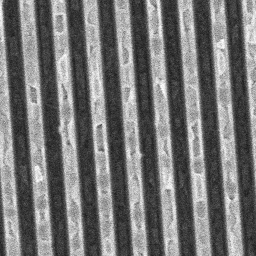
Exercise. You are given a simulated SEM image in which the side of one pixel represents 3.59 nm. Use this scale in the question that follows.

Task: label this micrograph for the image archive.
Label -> parallel lines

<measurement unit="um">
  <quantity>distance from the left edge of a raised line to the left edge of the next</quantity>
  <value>0.114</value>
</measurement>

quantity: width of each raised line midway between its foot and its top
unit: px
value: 16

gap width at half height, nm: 57.3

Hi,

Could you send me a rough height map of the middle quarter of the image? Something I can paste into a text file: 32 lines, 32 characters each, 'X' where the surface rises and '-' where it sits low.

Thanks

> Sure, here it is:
XX----XXXX----XXXX----XXXX----XX
XX----XXXX----XXXX----XXXX----XX
XX----XXXX----XXXX----XXXX----XX
XX----XXXX----XXXX----XXXX----XX
XX----XXXX----XXXX----XXXX----XX
XX----XXXX----XXXX----XXXX----XX
XX----XXXX----XXXX----XXXX----XX
XX----XXXX----XXXX----XXXX----XX
XX-----XXX----XXXX----XXXX----XX
XX-----XXX----XXXX----XXXX----XX
XX-----XXX----XXXX----XXXX----XX
XXX----XXX-----XXX-----XXX----XX
XXX----XXX-----XXX-----XXX----XX
XXX----XXX-----XXXX----XXXX---XX
XXX----XXXX----XXXX----XXXX----X
XXX----XXXX----XXXX----XXXX----X
XXX----XXXX----XXXX----XXXX----X
XXX----XXXX----XXXX----XXXX----X
XXX----XXXX----XXXX----XXXX----X
XXX----XXXX----XXXX----XXXX----X
XXX----XXXX----XXXX----XXXX----X
XXX-----XXX----XXXX----XXXX----X
XXX-----XXX----XXXX----XXXX----X
XXX-----XXX----XXXX----XXXX----X
XXXX----XXX-----XXX-----XXX----X
XXXX----XXX-----XXX-----XXX----X
XXXX----XXX-----XXX-----XXX----X
XXXX----XXXX----XXXX----XXXX----
XXXX----XXXX----XXXX----XXXX----
XXXX----XXXX----XXXX----XXXX----
XXXX----XXXX----XXXX----XXXX----
XXXX----XXXX----XXXX----XXXX----